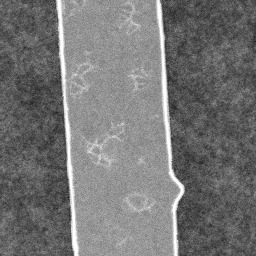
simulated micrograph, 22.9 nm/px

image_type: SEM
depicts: one or a few lines or trenches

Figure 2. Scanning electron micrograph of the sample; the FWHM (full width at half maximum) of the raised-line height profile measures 2280 nanometers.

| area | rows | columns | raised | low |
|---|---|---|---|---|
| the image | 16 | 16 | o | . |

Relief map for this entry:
....oooooo......
....oooooo......
....oooooo......
....oooooo......
....oooooo......
....oooooo......
....oooooo......
....oooooo......
....oooooo......
....ooooooo.....
....ooooooo.....
....ooooooo.....
.....oooooo.....
.....oooooo.....
.....oooooo.....
.....oooooo.....